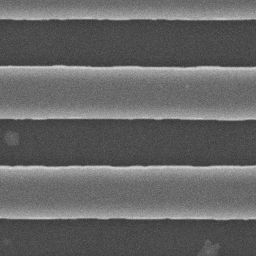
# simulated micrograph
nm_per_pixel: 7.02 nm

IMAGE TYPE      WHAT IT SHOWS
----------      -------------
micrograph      lines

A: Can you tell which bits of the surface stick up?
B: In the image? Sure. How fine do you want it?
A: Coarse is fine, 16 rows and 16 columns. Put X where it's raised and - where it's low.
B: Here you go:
XXXXXXXXXXXXXXXX
----------------
----------------
----------------
XXXXXXXXXXXXXXXX
XXXXXXXXXXXXXXXX
XXXXXXXXXXXXXXXX
----------------
----------------
----------------
XXXXXXXXXXXXXXXX
XXXXXXXXXXXXXXXX
XXXXXXXXXXXXXXXX
XXXXXXXXXXXXXXXX
----------------
----------------